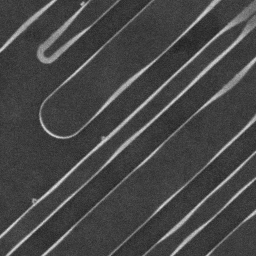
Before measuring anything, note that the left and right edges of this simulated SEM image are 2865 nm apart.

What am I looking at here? groups of lines, slits or small figures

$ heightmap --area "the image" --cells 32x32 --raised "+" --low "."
++++++.....+++.....++++++++.....
+++++.....+++....+++++++++.....+
++++.....+++....+++++++++.....++
+++.....+++....+++++++++....+++.
++.....+++....+++++++++....+++..
+.....+++....+++++++++....+++...
.....+++....+++++++++....+++....
...........++++++++.....+++.....
..........++++++++.....+++.....+
.........++++++++.....+++.....++
........++++++++.....+++.....+++
.......++++++++.....+++.....++++
......++++++++.....+++....++++++
.....++++++++....++++....+++++++
.....+++++++....++++....++++++++
.....++++++....++++....++++++++.
......++++....+++.....++++++++..
.............+++.....++++++++...
............+++.....++++++++....
...........+++.....++++++++....+
..........+++.....++++++++....++
.........+++....+++++++++....+++
........+++....+++++++++....++++
.......+++....+++++++++....++++.
......+++....+++++++++....++++..
....++++....+++++++++....++++...
...++++....+++++++++....+++.....
..++++....+++++++++....+++.....+
.++++....++++++++.....+++.....++
++++....++++++++.....+++....++++
++.....++++++++....++++....+++++
+.....++++++++....++++....++++++